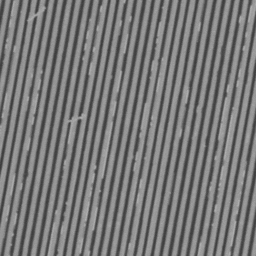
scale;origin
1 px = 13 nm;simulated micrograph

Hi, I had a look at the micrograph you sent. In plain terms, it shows parallel lines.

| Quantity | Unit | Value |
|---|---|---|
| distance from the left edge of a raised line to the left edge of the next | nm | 113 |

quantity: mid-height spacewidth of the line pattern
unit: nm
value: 51.2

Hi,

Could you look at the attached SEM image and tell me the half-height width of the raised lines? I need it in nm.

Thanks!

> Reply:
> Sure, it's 63.9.